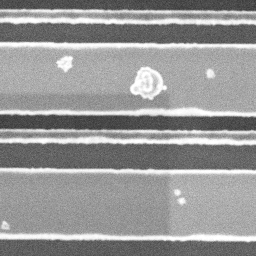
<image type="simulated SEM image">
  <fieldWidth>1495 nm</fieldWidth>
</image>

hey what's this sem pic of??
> lines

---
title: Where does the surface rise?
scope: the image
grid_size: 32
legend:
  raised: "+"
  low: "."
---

................................
+++++++++++++++++++++++++++..+..
+++.++++++++++++++++++++++++++++
................................
................................
++++++++++++++++++++.+.+........
++++++++++++++++++++++++++++++++
++++++++++++++++++++++++++++++++
++++++++++++++++++++++++++++++++
++++++++++++++++++++++++++++++++
++++++++++++++++++++++++++++++++
++++++++++++++++++++++++++++++++
++++++++++++++++++++++++++++++++
++++++++++++++++++++++++++++++++
................................
................................
++++++++++++++++++++++++++++++++
++++++++++++++++++++++++++++++++
................................
................................
................................
++++++++++++++++++++++++++++++++
++++++++++++++++++++++++++++++++
++++++++++++++++++++++++++++++++
++++++++++++++++++++++++++++++++
++++++++++++++++++++++++++++++++
++++++++++++++++++++++++++++++++
++++++++++++++++++++++++++++++++
++++++++++++++++++++++++++++++++
++++++++++++++++++++++++++++++++
................................
................................